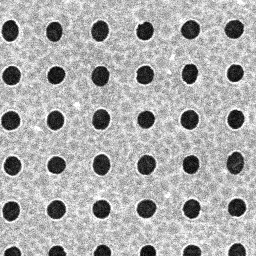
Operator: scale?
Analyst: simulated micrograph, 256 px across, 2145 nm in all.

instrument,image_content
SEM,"a regular array of holes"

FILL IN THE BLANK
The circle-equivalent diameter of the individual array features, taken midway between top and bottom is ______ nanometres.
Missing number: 161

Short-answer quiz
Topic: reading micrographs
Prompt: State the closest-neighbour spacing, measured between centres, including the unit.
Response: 369 nm